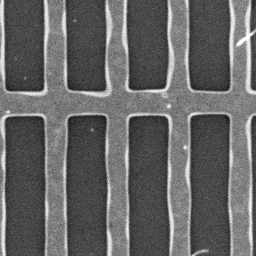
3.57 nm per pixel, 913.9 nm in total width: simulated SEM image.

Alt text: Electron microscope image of groups of lines, slits or small figures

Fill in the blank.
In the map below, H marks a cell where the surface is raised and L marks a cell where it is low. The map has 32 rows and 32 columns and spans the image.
LLLLLLHHLLLLLHHHLLLLLHHLLLLLLHHL
LLLLLLHHLLLLLHHHLLLLLHHLLLLLLHHL
LLLLLLHHLLLLLLHHLLLLLHHLLLLLLHHL
LLLLLLHHLLLLLLHHLLLLLHHLLLLLLHHL
LLLLLLHHLLLLLLHHLLLLLHHLLLLLLHHL
LLLLLLHHLLLLLHHHLLLLLHHLLLLLLHHL
LLLLLLHHLLLLLHHHLLLLLHHLLLLLLHHL
LLLLLLHHLLLLLHHHLLLLLHHLLLLLLHHL
LLLLLLHHLLLLLHHHLLLLLHHLLLLLLHHL
LLLLLLHHLLLLLHHHLLLLLHHLLLLLLHHL
HLLLLLHHLLLLLLHHLLLLLHHHLLLLLHHL
HLLLLHHHHHLLLHHHHHHHHHHHHHLLHHHH
HHHHHHHHHHHHHHHHHHHHHHHHHHHHHHHH
HHHHHHHHHHHHHHHHHHHHHHHHHHHHHHHH
HLLLLHHHHLLLLHHHLLLLLHHHLLLLHHHH
LLLLLLHHLLLLLHHHLLLLLHHHLLLLLHHL
LLLLLLHHLLLLLHHHLLLLLHHHLLLLLHHL
HLLLLLHHLLLLLHHHLLLLLHHHLLLLLHHL
HLLLLLHHLLLLLHHHLLLLLHHHLLLLLHHL
HLLLLLHHLLLLLHHHLLLLLHHHLLLLLHHL
LLLLLLHHLLLLLHHHLLLLLHHHLLLLLHHL
HLLLLLHHLLLLLHHHLLLLLHHLLLLLLHHL
HLLLLLHHLLLLLHHHLLLLLHHHLLLLLHHL
HLLLLLHHLLLLLLHHLLLLLHHHLLLLLHHL
LLLLLLHHLLLLLLHHLLLLLHHHLLLLLHHL
LLLLLLHHLLLLLLHHLLLLLHHHLLLLLHHL
HLLLLLHHLLLLLHHHLLLLLHHHLLLLLHHL
LLLLLLHHLLLLLHHHLLLLLHHHLLLLLHHL
LLLLLLHHLLLLLHHHLLLLLHHHLLLLLHHL
LLLLLLHHLLLLLLHHLLLLLHHHLLLLLHHL
LLLLLLHHLLLLLLHHLLLLLHHHLLLLLHHH
HLLLLLHHLLLLLLHHLLLLLHHHLLLLLHHH